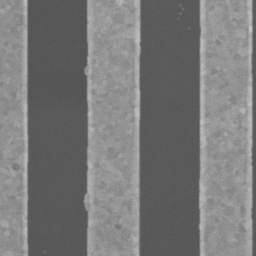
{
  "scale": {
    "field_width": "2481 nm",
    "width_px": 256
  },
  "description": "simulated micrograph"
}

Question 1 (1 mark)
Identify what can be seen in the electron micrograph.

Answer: lines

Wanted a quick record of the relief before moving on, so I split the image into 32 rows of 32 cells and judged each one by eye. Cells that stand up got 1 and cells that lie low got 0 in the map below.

11100000000111111000000001111110
11100000000111111000000001111110
11100000000111111000000001111110
11100000000111111000000001111110
11100000000111111000000001111110
11100000000111111000000001111110
11100000000111111000000001111110
11100000000111111000000001111110
11100000000111111000000001111110
11100000000111111000000001111110
11100000000111111000000001111110
11100000000111111000000001111110
11100000000111111000000001111110
11100000000111111000000001111110
11100000000111111000000001111110
11100000000111111000000001111110
11100000000111111000000001111110
11100000000111111000000001111110
11100000000111111000000001111110
11100000000111111000000001111110
11100000000111111000000001111110
11100000000111111000000001111110
11100000000111111000000001111110
11100000000111111000000001111110
11100000000111111000000001111110
11100000000111111000000001111110
11100000000111111000000001111110
11100000000111111000000001111110
11100000000111111000000001111110
11100000000111111000000001111110
11100000000111111000000001111110
11100000000111111000000001111110